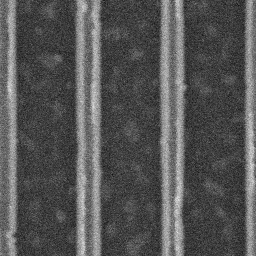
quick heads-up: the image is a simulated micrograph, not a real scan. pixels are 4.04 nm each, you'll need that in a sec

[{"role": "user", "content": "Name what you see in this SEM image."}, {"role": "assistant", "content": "one or a few lines or trenches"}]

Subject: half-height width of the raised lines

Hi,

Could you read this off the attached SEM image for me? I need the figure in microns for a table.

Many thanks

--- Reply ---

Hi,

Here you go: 0.0682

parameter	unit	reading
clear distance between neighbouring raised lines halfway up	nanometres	270